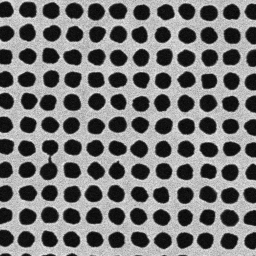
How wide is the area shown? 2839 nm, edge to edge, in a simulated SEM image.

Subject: a regular array of holes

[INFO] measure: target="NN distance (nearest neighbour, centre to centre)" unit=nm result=243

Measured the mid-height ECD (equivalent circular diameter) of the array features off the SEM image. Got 0.187 micrometres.